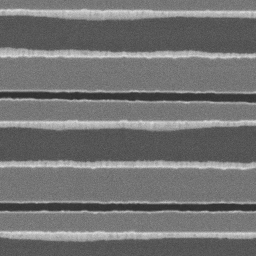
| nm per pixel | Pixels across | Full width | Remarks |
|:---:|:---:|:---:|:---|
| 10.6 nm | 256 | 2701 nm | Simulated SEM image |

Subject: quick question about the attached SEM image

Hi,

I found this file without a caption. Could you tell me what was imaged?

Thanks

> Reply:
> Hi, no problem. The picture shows lines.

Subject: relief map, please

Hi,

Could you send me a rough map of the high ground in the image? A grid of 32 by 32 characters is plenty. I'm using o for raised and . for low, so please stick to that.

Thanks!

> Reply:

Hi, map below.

oooooooooooooooooooooooooooooooo
....oooooooooooooooooooooooooooo
................................
................................
................................
................................
................................
oooooooooooooooooooooooooooooooo
oooooooooooooooooooooooooooooooo
oooooooooooooooooooooooooooooooo
oooooooooooooooooooooooooooooooo
oooooooooooooooooooooooooooooooo
oooooooooooooooooooooooooooooooo
oooooooooooooooooooooooooooooooo
oooooooooooooooooooooooooooooooo
......oo..........oooo..........
................................
................................
................................
................................
................................
oooooooooooooooooooooooooooooooo
oooooooooooooooooooooooooooooooo
oooooooooooooooooooooooooooooooo
oooooooooooooooooooooooooooooooo
oooooooooooooooooooooooooooooooo
oooooooooooooooooooooooooooooooo
oooooooooooooooooooooooooooooooo
oooooooooooooooooooooooooooooooo
................................
................................
................................